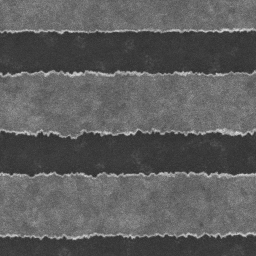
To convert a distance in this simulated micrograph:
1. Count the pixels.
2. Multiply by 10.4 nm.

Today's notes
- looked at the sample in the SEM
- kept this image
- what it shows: one or a few lines or trenches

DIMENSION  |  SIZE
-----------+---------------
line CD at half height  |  634 nanometers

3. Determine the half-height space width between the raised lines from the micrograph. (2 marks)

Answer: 441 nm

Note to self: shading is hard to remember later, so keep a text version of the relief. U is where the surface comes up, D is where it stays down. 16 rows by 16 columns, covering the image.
UUUUUUUUUUUUUUUU
UUUUUUUUUUUUUUUU
DDDDDDDDDDDDDDDD
DDDDDDDDDDDDDDDD
DDDUDDDDDDDDDDDD
UUUUUUUUUUUUUUUU
UUUUUUUUUUUUUUUU
UUUUUUUUUUUUUUUU
DDDDUDDDDDDDDDDD
DDDDDDDDDDDDDDDD
DDDDDDDDDDDDDDDD
UUUUUUUUUUUUUUUU
UUUUUUUUUUUUUUUU
UUUUUUUUUUUUUUUU
UUUUUUUUUUUUUUUU
DDDDDDDDDDDDDDDD